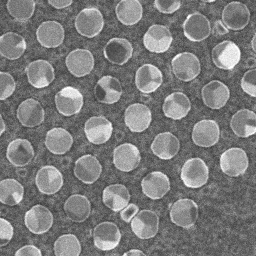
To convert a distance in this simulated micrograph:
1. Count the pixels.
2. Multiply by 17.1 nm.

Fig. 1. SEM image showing a regular array of raised bodies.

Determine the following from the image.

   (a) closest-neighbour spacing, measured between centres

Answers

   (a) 682 nanometers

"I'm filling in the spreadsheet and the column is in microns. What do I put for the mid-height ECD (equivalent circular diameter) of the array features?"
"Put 0.464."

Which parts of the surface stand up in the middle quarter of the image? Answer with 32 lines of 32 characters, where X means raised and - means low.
-XXXXXX-------------XX--XXXXXXXX
-XXXXXX------------XXXXX--XXXXXX
---XXX------------XXXXXX----XXXX
X---------XX------XXXXXX----XXXX
---------XXXXX----XXXXXX--------
--------XXXXXX----XXXXXX---X----
XXX-----XXXXXX-----XXXX------X--
XXXX----XXXXXX-------------XXX--
XXXXX---XXXXXX-----XX-----XXXXX-
XXXXX-----XXX------------XXXXXX-
XXXX-X-----------XXX-----XXXXXX-
XXXX------------XXXXX----XXXXXX-
XX-------------XXXXXXX---XXXXXX-
-------XXX-----XXXXXXX-----XX---
---X--XXXXX----XXXXXX-----------
-----XXXXXXX----XXXXX-----------
-----XXXXXXX-----XXX------------
X-----XXXXXX-XX---------XXX-----
XX----XXXXX--XX--------XXXXX----
XX-----XXX------------XXXXXXX---
XX------------XXX-----XXXXXXX---
X------------XXXXX----XXXXXXX---
-------------XXXXXX----XXXXX----
X---XXXX-----XXXXXX------X------
X--XXXXX-----XXXXXX------------X
X--XXXXXX----XXXXX------------XX
X--XXXXXX-----XXX-------------XX
---XXXXXX------------XXXX-XX-XXX
----XXXX------------XXXXXX---XXX
-----XX-------------XXXXXX----XX
-----------XXXX-----XXXXXX------
----------XXXXXX----XXXXXX---X--